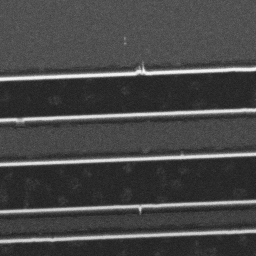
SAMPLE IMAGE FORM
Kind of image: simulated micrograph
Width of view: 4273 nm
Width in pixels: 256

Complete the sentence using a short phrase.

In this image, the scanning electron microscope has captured one or a few lines or trenches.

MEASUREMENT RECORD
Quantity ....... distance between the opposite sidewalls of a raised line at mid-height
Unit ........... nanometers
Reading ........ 750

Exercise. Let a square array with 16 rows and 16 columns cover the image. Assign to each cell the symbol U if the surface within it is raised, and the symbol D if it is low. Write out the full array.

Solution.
DDDDDDDDDDDDDDDD
DDDDDDDDDDDDDDDD
DDDDDDDDDDDDDDDD
DDDDDDDDDDDDDDDD
DDDDDDDDDDDUUUUU
UUUUUUUUUUUUUUUU
UUUUUUUUUUUUUUUU
UUDDDDDDDDDDDDDD
DDDDDDDDDDDDDDDD
DDDDDDDDDDDDDDDD
UUUUUUUUUUUUUUUU
UUUUUUUUUUUUUUUU
UUUUUUUUUUUUUUUU
DDDDDDDDDDDDDDDD
DDDDDDDDDDDDDDDU
UUUUUUUUUUUUUUUU